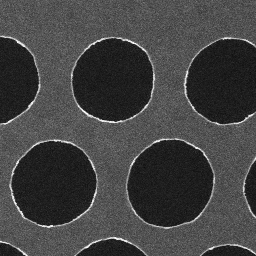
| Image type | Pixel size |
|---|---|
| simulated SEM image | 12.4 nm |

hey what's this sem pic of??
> holes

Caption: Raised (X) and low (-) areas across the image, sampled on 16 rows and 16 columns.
XXXXXXXXXXXXXXXX
XXXXXXXXXXXXXXXX
-XXXXX--XXXXXX-X
--XXX----XXX----
--XXX-----XX----
--XXX-----XX----
--XXX----XXX----
-XXXXXX-XXXXX--X
XXXXXXXXXXXXXXXX
XX---XXXX----XXX
X-----XX-----XXX
X-----XX-----XX-
X-----XX-----XX-
XX---XXXX---XXXX
XXXXXXXXXXXXXXXX
-XXXX----XXXX--X